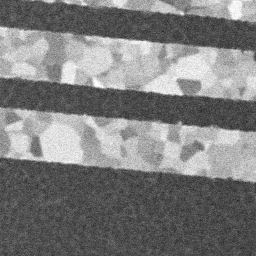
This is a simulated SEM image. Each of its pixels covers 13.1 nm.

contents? one or a few lines or trenches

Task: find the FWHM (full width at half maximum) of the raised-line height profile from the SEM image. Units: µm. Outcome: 0.635